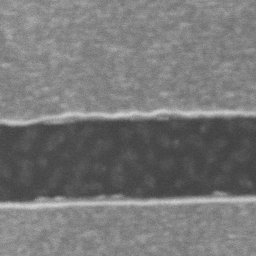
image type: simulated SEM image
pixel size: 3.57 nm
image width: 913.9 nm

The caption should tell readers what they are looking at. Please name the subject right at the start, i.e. one or a few lines or trenches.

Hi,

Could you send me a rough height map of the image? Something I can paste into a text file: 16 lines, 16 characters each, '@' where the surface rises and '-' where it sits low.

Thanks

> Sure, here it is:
@@@@@@@@@@@@@@@@
@@@@@@@@@@@@@@@@
@@@@@@@@@@@@@@@@
@@@@@@@@@@@@@@@@
@@@@@@@@@@@@@@@@
@@@@@@@@@@@@@@@@
@@@@@@@@@@@@@@@@
@@--------------
----------------
----------------
----------------
----------------
---------------@
@@@@@@@@@@@@@@@@
@@@@@@@@@@@@@@@@
@@@@@@@@@@@@@@@@